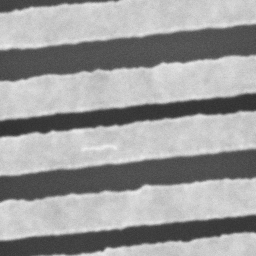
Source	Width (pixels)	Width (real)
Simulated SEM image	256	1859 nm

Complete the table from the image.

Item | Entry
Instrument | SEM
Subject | lines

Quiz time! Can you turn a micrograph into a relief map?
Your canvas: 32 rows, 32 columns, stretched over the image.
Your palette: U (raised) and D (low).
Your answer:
DDDDDDDDDDUUUUUUUUUUUUUUUUUUUUUU
DUUUUUUUUUUUUUUUUUUUUUUUUUUUUUUU
UUUUUUUUUUUUUUUUUUUUUUUUUUUUUUUU
UUUUUUUUUUUUUUUUUUUUUUUUUUDDDDDD
UUUUUUUUUUUUUUUUUUDDDDDDDDDDDDDD
UUUUUUUUDDDDDDDDDDDDDDDDDDDDDDDD
DDDDDDDDDDDDDDDDDDDDDDDDDDDDDDDD
DDDDDDDDDDDDDDDDDDDDDDDDDDUUUUUU
DDDDDDDDDDDDDDDDDUDUUUUUUUUUUUUU
DDDDDUUUUUUUUUUUUUUUUUUUUUUUUUUU
UUUUUUUUUUUUUUUUUUUUUUUUUUUUUUUU
UUUUUUUUUUUUUUUUUUUUUUUUUUUUUUUU
UUUUUUUUUUUUUUUUUUUUUUUUDDDDDDDD
UUUUUUUUUUUUUUDDDDDDDDDDDDDDDDDD
UUUUUUDDDDDDDDDDDDDDDDDUUUUUUUUU
DDDDDDDDDDDDDDDDUUUUUUUUUUUUUUUU
DDDDDDUUUUUUUUUUUUUUUUUUUUUUUUUU
UUUUUUUUUUUUUUUUUUUUUUUUUUUUUUUU
UUUUUUUUUUUUUUUUUUUUUUUUUUUUUUUU
UUUUUUUUUUUUUUUUUUUUUUUDDDDDDDDD
UUUUUUUUUUUUUDDDDDDDDDDDDDDDDDDD
UUUUUDDDDDDDDDDDDDDDDDDDDDDDDDDD
DDDDDDDDDDDDDDDDDDDDDDDDDDDUUUUU
DDDDDDDDDDDDDDDDDDUUUUUUUUUUUUUU
DDDDDDDDUUUUUUUUUUUUUUUUUUUUUUUU
UUUUUUUUUUUUUUUUUUUUUUUUUUUUUUUU
UUUUUUUUUUUUUUUUUUUUUUUUUUUUUUUU
UUUUUUUUUUUUUUUUUUUUUUUUUDDDDDDD
UUUUUUUUUUUUUUUUDDDDDDDDDDDDDDDD
UUUUUDDDDDDDDDDDDDDDDDDDDDDUUUUU
DDDDDDDDDDDDDDDDDDUUUUUUUUUUUUUU
DDDDDDDDDDDDUUUUUUUUUUUUUUUUUUUU